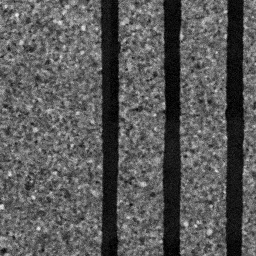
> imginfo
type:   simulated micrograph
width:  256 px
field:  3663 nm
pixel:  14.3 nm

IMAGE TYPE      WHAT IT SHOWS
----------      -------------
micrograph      one or a few lines or trenches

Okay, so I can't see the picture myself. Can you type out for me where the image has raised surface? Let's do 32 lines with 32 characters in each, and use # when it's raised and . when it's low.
#############..#####...#####...#
#############..#####...#####...#
############...#####...#####..##
#############..#####...#####..##
#############..#####...#####..##
#############..#####...#####..##
#############..#####...#####..##
#############..#####...#####..##
#############..#####...#####..##
#############..######..#####..##
#############..######..#####..##
#############..#####...#####..##
#############..######..#####...#
#############..######..#####...#
#############..######..#####...#
#############..######..#####...#
#############..#####...#####...#
#############..#####...#####..##
#############..#####...#####..##
#############..#####...#####..##
#############..#####...#####..##
#############..#####...#####....
#############..#####...#####..##
#############..#####...#####..##
#############..#####...#####..##
#############..#####...#####..##
#############..#####...#####..##
#############..#####...#####..##
#############..#####...#####..##
#############..#####...#####..##
#############..#####...#####..##
#############..#####...#####..##